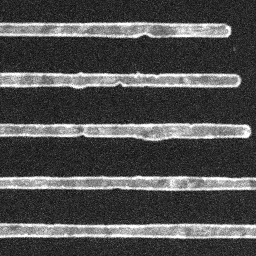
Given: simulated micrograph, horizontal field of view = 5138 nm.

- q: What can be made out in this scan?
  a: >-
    parallel lines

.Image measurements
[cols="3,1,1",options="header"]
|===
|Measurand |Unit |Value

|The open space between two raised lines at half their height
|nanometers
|790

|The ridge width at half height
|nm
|218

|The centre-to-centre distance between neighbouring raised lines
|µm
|1.01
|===